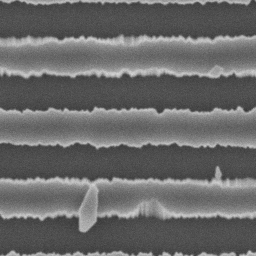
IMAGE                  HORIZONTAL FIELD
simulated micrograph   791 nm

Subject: lines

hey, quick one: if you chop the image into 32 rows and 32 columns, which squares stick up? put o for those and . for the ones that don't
................................
................................
................................
................................
................................
oooooooooooooooooooooooooooooooo
oooooooooooooooooooooooooooooooo
oooooooooooooooooooooooooooooooo
oooooooooooooooooooooooooooooooo
...o......................o.....
................................
................................
................................
................................
oooooooooooooooooooooooooooooooo
oooooooooooooooooooooooooooooooo
oooooooooooooooooooooooooooooooo
oooooooooooooooooooooooooooooooo
................................
................................
................................
...........................o....
o...o.ooo...o.oo..o........o....
oooooooooooooooooooooooooooooooo
oooooooooooooooooooooooooooooooo
oooooooooooooooooooooooooooooooo
ooooooooooooooooo...oooooooooooo
..........oo....................
..........o.....................
................................
................................
.o............o................o